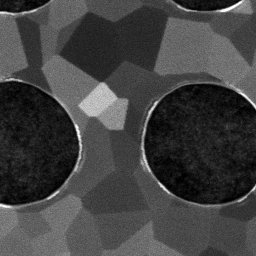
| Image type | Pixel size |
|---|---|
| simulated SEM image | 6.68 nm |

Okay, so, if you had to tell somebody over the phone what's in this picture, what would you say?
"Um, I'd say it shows holes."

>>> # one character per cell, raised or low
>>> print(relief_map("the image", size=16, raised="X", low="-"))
--XXXXXXXXXX--XX
XXXXXXXXXXXXXXXX
XXXXXXXXXXXXXXXX
XXXXXXXXXXXXXXXX
XXXXXXXXXXXXXXXX
--XXXXXXXXX---XX
----XXXXXX------
----XXXXX-------
-----XXXX-------
-----XXXX-------
-----XXXX-------
----XXXXXX------
---XXXXXXXX----X
XXXXXXXXXXXXXXXX
XXXXXXXXXXXXXXXX
XXXXXXXXXXXXXXXX